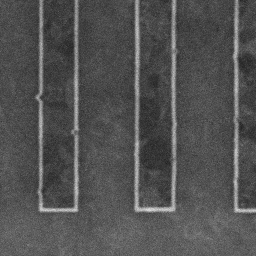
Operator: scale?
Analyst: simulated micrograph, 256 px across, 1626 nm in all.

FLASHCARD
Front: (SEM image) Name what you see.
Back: one or a few lines or trenches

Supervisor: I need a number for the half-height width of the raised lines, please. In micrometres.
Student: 0.229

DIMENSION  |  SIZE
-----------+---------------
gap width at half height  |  387 nm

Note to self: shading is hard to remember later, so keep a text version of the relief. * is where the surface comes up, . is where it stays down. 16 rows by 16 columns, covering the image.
...**....**....*
...**....**....*
...**....**....*
...**....**....*
...**....**....*
...**....**....*
...**....**....*
...**....**....*
...**....**....*
...**....**....*
...**....**....*
...**....**....*
...**....**....*
................
................
................